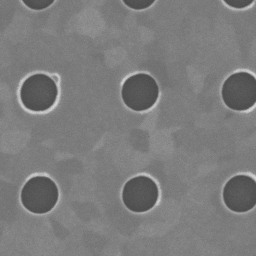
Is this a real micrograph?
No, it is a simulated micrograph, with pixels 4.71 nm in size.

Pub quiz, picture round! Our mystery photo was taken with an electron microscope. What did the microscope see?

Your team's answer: holes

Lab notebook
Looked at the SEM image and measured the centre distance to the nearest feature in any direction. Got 0.473 um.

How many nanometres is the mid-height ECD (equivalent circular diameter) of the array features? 179